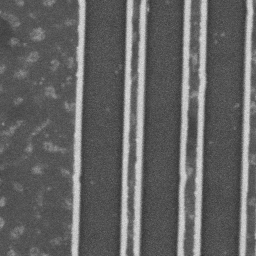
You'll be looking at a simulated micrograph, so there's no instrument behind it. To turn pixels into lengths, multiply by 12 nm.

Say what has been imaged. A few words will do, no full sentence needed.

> one or a few lines or trenches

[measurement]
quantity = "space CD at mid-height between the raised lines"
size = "0.544 um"